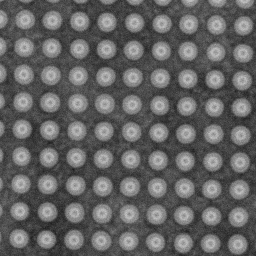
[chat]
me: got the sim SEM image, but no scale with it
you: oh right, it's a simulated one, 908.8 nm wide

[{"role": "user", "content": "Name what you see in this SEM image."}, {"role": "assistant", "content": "an array of small figures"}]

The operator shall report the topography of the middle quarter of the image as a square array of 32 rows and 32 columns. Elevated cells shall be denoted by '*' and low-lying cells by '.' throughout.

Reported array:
................................
..***....***....***....**.....*.
.*****..*****..****...****...***
.*****..*****..*****..****...***
..***...****...****...****...***
..........*.....**.....**....***
................................
................................
..***...****...****...***.....**
.*****..*****..****...****...***
.*****..*****..****...****..****
..***...****...****...****..****
................*......**....***
................................
...*............................
.****...****...****...***....***
.****...****...****...****..****
.****...****...****..*****..****
..***...****...****...****..****
.......................*.....***
................................
..**.....**.....................
.****...****...****...***....***
.****...****..*****..*****..****
.****...****..*****..*****..****
..**....***....***....****..****
.............................**.
................................
.***.....**.....*...............
.****...****..*****..****...****
.****..*****..*****..*****..****
.****..*****..*****..*****..****